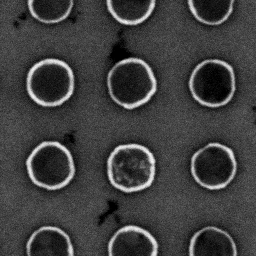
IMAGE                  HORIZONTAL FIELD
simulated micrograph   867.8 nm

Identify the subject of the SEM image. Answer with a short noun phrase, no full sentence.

raised bodies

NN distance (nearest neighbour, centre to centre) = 0.275 micrometres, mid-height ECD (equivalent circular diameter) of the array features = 160 nm